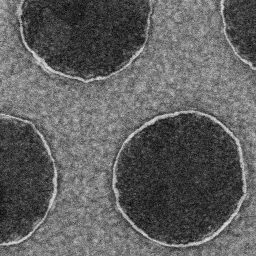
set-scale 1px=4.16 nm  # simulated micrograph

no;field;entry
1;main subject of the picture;raised bodies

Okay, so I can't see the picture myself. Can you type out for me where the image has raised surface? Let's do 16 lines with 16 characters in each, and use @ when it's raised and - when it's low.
-@@@@@@@@-----@@
-@@@@@@@@-----@@
-@@@@@@@@-----@@
--@@@@@@@------@
---@@@@---------
----------------
----------------
@---------@@@@--
@@@-----@@@@@@@-
@@@----@@@@@@@@-
@@@----@@@@@@@@-
@@@@---@@@@@@@@-
@@@----@@@@@@@@-
@@@-----@@@@@@@-
@@-------@@@@@--
----------------